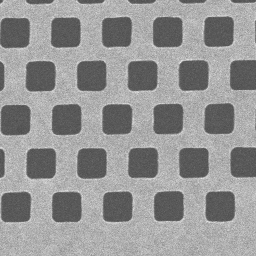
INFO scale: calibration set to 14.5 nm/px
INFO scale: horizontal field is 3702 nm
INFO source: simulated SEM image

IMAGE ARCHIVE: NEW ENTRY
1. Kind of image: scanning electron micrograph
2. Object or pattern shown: a regular array of holes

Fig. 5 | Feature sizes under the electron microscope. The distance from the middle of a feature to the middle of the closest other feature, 729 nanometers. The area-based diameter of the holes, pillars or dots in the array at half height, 478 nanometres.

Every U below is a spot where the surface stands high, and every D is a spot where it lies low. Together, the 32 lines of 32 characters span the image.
UUUUDDUUUUUUUUUUUDDUUUUDUUUUUUUU
UUUUUUUUUUUUUUUUUUUUUUUUUUUUUUUU
DDDUUUUDDDUUUDDDUUUDDDDUUUDDDUUU
DDDDUUDDDDUUUDDDUUUDDDDUUDDDDUUU
DDDDUUDDDDUUUDDDUUUDDDDUUDDDDUUU
DDDDUUDDDDUUUDDDUUUDDDDUUUDDDUUU
UUUUUUUUUUUUUUUUUUUUUUUUUUUUUUUU
UUUUUUUUUUUUUUUUUUUUUUUUUUUUUUDD
DUUDDDDUUUDDDUUUDDDDUUDDDDUUUDDD
DUUDDDDUUUDDDUUUDDDDUUDDDDUUUDDD
DUUDDDDUUUDDDUUUDDDDUUDDDDUUUDDD
UUUUUUUUUUUUUUUUUUUUUUUUUUUUUUUU
UUUUUUUUUUUUUUUUUUUUUUUUUUUUUUUU
DDDDUUUDDDUUUDDDUUUDDDDUUUDDDUUU
DDDDUUDDDDUUUDDDDUUDDDDUUUDDDUUU
DDDDUUDDDDUUUDDDDUUDDDDUUUDDDUUU
DDDDUUUDDDUUUDDDUUUDDDUUUUDDDUUU
UUUUUUUUUUUUUUUUUUUUUUUUUUUUUUUU
UUUUDDUUUUUDUUUUUDDUUUUDDUUUUDDD
DUUDDDDUUUDDDUUUDDDDUUDDDDUUUDDD
DUUDDDDUUUDDDUUUDDDDUUDDDDUUUDDD
DUUDDDDUUUDDDUUUDDDDUUDDDDUUUDDD
UUUUUUUUUUUUUUUUUUUUUUUUUUUUUUUU
UUUUUUUUUUUUUUUUUUUUUUUUUUUUUUUU
DDDDUUUDDDUUUDDDUUUDDDDUUUDDDUUU
DDDDUUDDDDUUUDDDDUUDDDDUUUDDDUUU
DDDDUUDDDDUUUDDDDUUDDDDUUUDDDUUU
DDDDUUUDDDUUUDDDUUUUDDDUUUDDDUUU
UUUUUUUUUUUUUUUUUUUUUUUUUUUUUUUU
UUUUUUUUUUUUUUUUUUUUUUUUUUUUUUUU
UUUUUUUUUUUUUUUUUUUUUUUUUUUUUUUU
UUUUUUUUUUUUUUUUUUUUUUUUUUUUUUUU